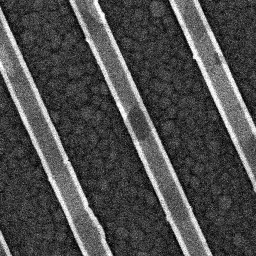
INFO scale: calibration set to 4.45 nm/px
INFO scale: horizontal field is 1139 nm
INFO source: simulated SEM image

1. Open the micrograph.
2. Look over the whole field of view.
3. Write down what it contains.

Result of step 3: one or a few lines or trenches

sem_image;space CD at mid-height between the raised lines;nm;310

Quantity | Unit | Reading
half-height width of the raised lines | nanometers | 95.8